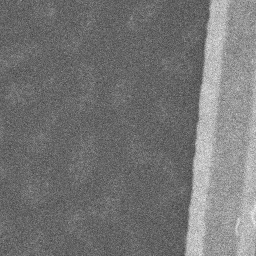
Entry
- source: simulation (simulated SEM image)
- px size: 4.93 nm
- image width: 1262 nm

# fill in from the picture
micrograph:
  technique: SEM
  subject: one or a few lines or trenches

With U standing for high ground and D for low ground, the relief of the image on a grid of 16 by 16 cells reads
DDDDDDDDDDDDDDUU
DDDDDDDDDDDDDDUU
DDDDDDDDDDDDDUUU
DDDDDDDDDDDDDUUU
DDDDDDDDDDDDDUUU
DDDDDDDDDDDDDUUU
DDDDDDDDDDDDDUUU
DDDDDDDDDDDDDUUU
DDDDDDDDDDDDDUUU
DDDDDDDDDDDDDUUU
DDDDDDDDDDDDDUUU
DDDDDDDDDDDDDUUU
DDDDDDDDDDDDUUUU
DDDDDDDDDDDDUUUU
DDDDDDDDDDDDUUUU
DDDDDDDDDDDDUUUD